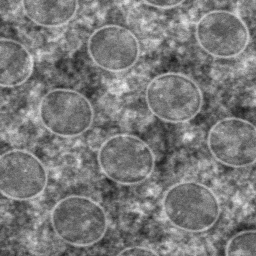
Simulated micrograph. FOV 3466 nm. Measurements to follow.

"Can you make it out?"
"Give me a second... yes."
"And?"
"raised bodies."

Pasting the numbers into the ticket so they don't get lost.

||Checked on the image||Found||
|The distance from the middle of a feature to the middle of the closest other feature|1050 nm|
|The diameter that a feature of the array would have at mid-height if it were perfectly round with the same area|697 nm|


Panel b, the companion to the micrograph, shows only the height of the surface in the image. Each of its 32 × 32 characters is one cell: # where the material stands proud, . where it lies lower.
...#######.........###..........
...######..................#....
....#####................#####..
.............##..........######.
............#####........######.
##.........######........######.
###........######.........####..
####........#####...............
####.........###................
####................###.........
##.................#####........
......###.........#######.......
.....######.......#######.......
.....######........######.......
.....#######........####........
......#####................####.
.......###................######
..............###.........######
.............######.......######
####........#######........#####
#####........######.........###.
######.......######.............
######........####..............
#####................#####......
.###.................######.....
.......#####........#######.....
.......######........######.....
.......######........######.....
.......######..........###......
.......######................###
.........##..................###
...............####.........####